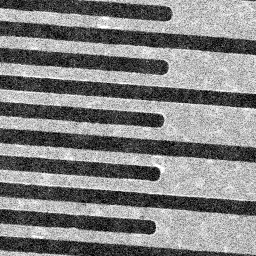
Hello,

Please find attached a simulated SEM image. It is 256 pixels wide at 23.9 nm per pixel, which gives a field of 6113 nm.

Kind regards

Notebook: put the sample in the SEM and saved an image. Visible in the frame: parallel lines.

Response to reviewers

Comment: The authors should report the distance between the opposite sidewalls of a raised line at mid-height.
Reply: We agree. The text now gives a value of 271 nm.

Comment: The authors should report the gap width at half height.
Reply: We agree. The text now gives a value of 369 nanometers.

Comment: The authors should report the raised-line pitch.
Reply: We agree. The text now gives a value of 639 nm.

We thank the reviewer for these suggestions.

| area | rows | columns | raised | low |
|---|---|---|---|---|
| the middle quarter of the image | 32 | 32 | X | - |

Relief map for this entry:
--------------------------XXXXXX
XXXXXX--------------------XXXXXX
XXXXXXXXXXXXXXXXXXX-------XXXXXX
XXXXXXXXXXXXXXXXXXXXXXXXXXXXXXXX
------------XXXXXXXXXXXXXXXXXXXX
-------------------------XXXXXXX
--------------------------------
--------------------------------
XXXXXXXXX-----------------------
XXXXXXXXXXXXXXXXXXXXXX----------
--XXXXXXXXXXXXXXXXXXXXXXXXXXXXXX
--------------XXXXXXXXX-XXXXXXXX
------------------------XXXXXXXX
-------------------------XXXXXXX
X------------------------XXXXXXX
XXXXXXXXXXXXXX-----------XXXXXXX
XXXXXXXXXXXXXXXXXXXXXXXXXXXXXXXX
------XXXXXXXXXXXXXXXXXXXXXXXXXX
-------------------XXXXXXXXXXXXX
--------------------------------
--------------------------------
XXXX----------------------------
XXXXXXXXXXXXXXXXXX--------------
-XXXXXXXXXXXXXXXXXXXXXXXXXXXXXX-
-----------XXXXXXXXXXXXXXXXXXXXX
----------------------XXXXXXXXXX
------------------------XXXXXXXX
------------------------XXXXXXXX
XXXXXXXXXX--------------XXXXXXXX
XXXXXXXXXXXXXXXXXXXXXXXXXXXXXXXX
XXXXXXXXXXXXXXXXXXXXXXXXXXXXXXXX
------------XXXXXXXXXXXXXXXXXXXX